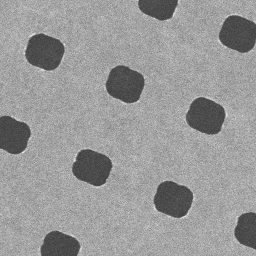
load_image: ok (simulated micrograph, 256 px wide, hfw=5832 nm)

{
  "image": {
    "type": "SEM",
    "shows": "holes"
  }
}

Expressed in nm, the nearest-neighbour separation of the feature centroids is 1980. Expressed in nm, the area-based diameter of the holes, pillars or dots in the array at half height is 858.